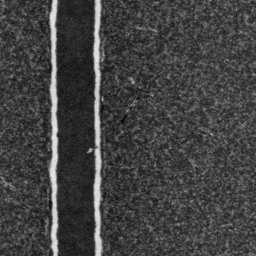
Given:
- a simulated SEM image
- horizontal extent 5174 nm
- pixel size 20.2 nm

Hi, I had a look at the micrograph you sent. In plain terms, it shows one or a few lines or trenches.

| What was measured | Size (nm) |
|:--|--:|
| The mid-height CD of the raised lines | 872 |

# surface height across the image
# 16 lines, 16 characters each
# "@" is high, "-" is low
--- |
---@@@----------
---@@@----------
---@@@----------
---@@@----------
---@@@----------
---@@@----------
---@@@----------
---@@@----------
---@@@----------
---@@@----------
---@@@----------
---@@@----------
---@@@----------
---@@@----------
---@@@----------
---@@@----------